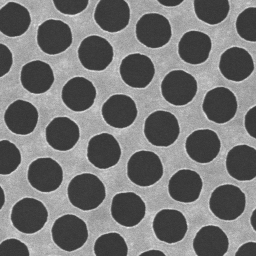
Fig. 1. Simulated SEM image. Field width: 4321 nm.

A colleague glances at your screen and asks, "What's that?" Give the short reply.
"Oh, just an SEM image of a regular array of holes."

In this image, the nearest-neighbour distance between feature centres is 733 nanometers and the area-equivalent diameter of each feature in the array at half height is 593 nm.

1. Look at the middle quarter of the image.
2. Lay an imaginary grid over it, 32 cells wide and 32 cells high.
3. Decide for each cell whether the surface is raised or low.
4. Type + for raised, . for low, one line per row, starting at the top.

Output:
+++++......+++........++++++++++
+++++++...++++.........+++++.+++
++++++++++++++.........+++.....+
++...+++++++++........+++.......
+......++++++++.......++........
.......++++++++++....+++........
........++++++++++++++++........
........+++++++++++++++++.......
........+++......++++++++.......
........++........++++++++.....+
+......+++........++++++++++++++
++...++++.........++++++++++++++
+++++++++.........++++.....+++++
.+++++++++........+++.......++++
...++++++++......+++........++++
....++++++++....++++.........+++
....++++++++++++++++.........+++
....+++++..+++++++++.........+++
....+++......++++++++.......+++.
...+++.......++++++++.......++..
..++++........+++++++++...++++..
.+++++........++++++++++++++++..
++++++........+++......++++++++.
++++++........++........++++++++
++++++........++........++++++++
++++++++....++++.........+++++++
++++++++++++++++.........++++..+
+++++..+++++++++.........+++....
++.......+++++++........+++.....
+........++++++++......+++......
+.........+++++++++...++++......
+.........++++++++++++++++......